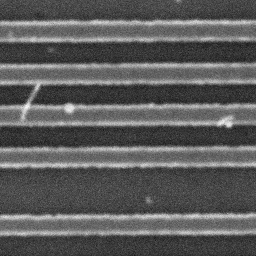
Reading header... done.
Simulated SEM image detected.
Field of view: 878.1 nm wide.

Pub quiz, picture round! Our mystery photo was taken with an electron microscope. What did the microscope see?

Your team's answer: lines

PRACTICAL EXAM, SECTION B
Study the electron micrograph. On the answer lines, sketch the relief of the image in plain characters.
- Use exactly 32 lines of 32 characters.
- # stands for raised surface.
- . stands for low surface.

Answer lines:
................................
................................
................................
################################
################################
................................
................................
................................
################################
################################
................................
................................
................................
################################
################################
#####################.#######...
................................
................................
..#.##.#...#####################
################################
################################
................................
................................
................................
................................
................................
................................
################################
################################
................................
................................
................................